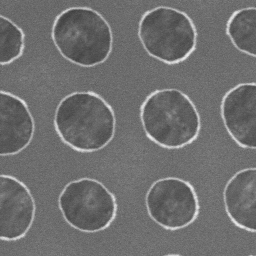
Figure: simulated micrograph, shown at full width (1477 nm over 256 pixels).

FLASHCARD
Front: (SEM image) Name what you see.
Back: holes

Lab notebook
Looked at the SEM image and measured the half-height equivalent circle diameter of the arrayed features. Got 314 nm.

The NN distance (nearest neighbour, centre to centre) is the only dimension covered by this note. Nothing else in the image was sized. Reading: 84.3 px